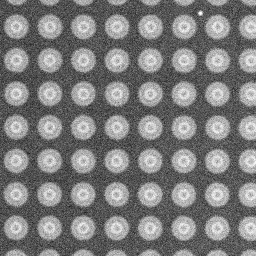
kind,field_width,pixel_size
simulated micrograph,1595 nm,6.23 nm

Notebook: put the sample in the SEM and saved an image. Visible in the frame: an array of small figures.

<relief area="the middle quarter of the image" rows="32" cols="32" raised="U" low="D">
DDUUUUUUDDDUUUUUDDDUUUUUDDDUUUUU
DDDUUUUDDDDUUUUDDDDDUUUDDDDDUUUU
DDDDDDDDDDDDDDDDDDDDDDDDDDDDDDDD
DDDDDDDDDDDDDDDDDDDDDDDDDDDDDDDD
DDDDDDDDDDDDDDDDDDDDDDDDDDDDDDDD
DDDUUUUDDDDUUUUDDDDUUUUUDDDDUUUU
DDUUUUUUDDUUUUUUDDDUUUUUDDDUUUUU
DDUUUUUUDDUUUUUUDDDUUUUUUDDUUUUU
DDUUUUUUDDUUUUUUDDDUUUUUDDDUUUUU
DDDUUUUDDDDUUUUDDDDUUUUUDDDDUUUU
DDDDDDDDDDDDDDDDDDDDDDDDDDDDDDDD
DDDDDDDDDDDDDDDDDDDDDDDDDDDDDDDD
DDDDDDDDDDDDDDDDDDDDDDDDDDDDDDDD
DDDUUUUDDDDUUUUDDDDDUUUDDDDDUUUU
DDUUUUUDDDDUUUUUDDDUUUUUDDDUUUUU
DDUUUUUUDDUUUUUUDDDUUUUUDDDUUUUU
DDUUUUUUDDUUUUUUDDDUUUUUDDDUUUUU
DDUUUUUDDDDUUUUUDDDUUUUUDDDDUUUU
DDDDUUDDDDDDUUUDDDDDUUUDDDDDUUUD
DDDDDDDDDDDDDDDDDDDDDDDDDDDDDDDD
DDDDDDDDDDDDDDDDDDDDDDDDDDDDDDDD
DDDDUUDDDDDDUUDDDDDDDUUDDDDDDUUD
DDUUUUUDDDDUUUUUDDDUUUUUDDDDUUUU
DDUUUUUUDDUUUUUUDDDUUUUUDDDUUUUU
DDUUUUUUDDUUUUUUDDDUUUUUDDDUUUUU
DDUUUUUUDDUUUUUUDDDUUUUUDDDUUUUU
DDDUUUUDDDDUUUUDDDDDUUUUDDDDUUUU
DDDDDDDDDDDDDDDDDDDDDDDDDDDDDDDD
DDDDDDDDDDDDDDDDDDDDDDDDDDDDDDDD
DDDDDDDDDDDDDDDDDDDDDDDDDDDDDDDD
DDDUUUUDDDDUUUUDDDDDUUUUDDDDUUUU
DDUUUUUDDDUUUUUUDDDUUUUUDDDUUUUU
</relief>